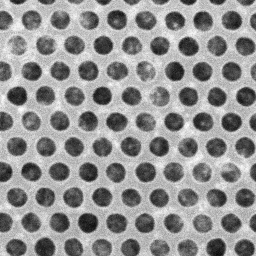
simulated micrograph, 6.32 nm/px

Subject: a regular array of holes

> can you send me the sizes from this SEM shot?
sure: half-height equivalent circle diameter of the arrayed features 130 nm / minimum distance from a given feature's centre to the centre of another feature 179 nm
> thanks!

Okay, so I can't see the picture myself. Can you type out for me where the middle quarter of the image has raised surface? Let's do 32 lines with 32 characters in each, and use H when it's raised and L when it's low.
LHHHLLLLHHHLLLLLHHLLLLLHHHLLLLHH
LLHLLLLLLHHLLLLLHHLLLLLHHLLLLLHH
LLHHLLLLLHHLLLLLHHLLLLLHHLLLLLHH
LHHHLLLLHHHLLLLHHHHLLLLHHHLLLLHH
HHHHHHHHHHHHHHHHHHHHLHHHHHHHHHHH
HHLHHHHHHHHHHHHHLHHHHHHHHHHHHHHH
LLLLHHHHLLLLHHHLLLLHHHLLLLHHHLLL
LLLLLHHLLLLLHHLLLLLHHLLLLLHHHLLL
LLLLLHHLLLLLHHLLLLLHHLLLLLLHHLLL
HLLLLHHHLLLLHHHLLLLHHHLLLLHHHLLL
HHLLHHHHHHHHHHHHLLHHHHHLLHHHHHLL
HHHHHHHHHHHHHHHHHHHHHHHHHHHHHHHH
LHHHLLLLHHHLLLLHHHHLLLHHHHLLLHHH
LHHHLLLLHHHLLLLLHHLLLLLHHLLLLLHH
LHHLLLLLLHLLLLLLHHLLLLLHHLLLLLHH
LHHHLLLLHHHLLLLLHHLLLLLHHLLLLLHH
LHHHHLLLHHHHLLLHHHHLLLHHHHLLLHHH
HHHHHHHHHHHHHHHHHHHHHHHHHHHHHHHH
HLLLHHHHLLHHHHHLLLHHHHHLLHHHHHLL
LLLLLHHLLLLLHHLLLLLHHHLLLLHHHLLL
LLLLLHHLLLLLHHLLLLLHHLLLLLHHLLLL
LLLLLHHLLLLLHHLLLLLHHLLLLLHHHLLL
HLLLHHHHLLLLHHHLLLLHHHLLLLHHHLLL
HHHHHHHHHHHHHHHHHHHHHHHHHHHHHHHL
HHHHHHHHHHHHHHHHHHHHLHHHHHHLHHHH
LHHHLLLLHHHLLLLHHHLLLLLHHLLLLLHH
LLHHLLLLLHLLLLLLHHLLLLLHHLLLLLHH
LLHHLLLLLHLLLLLLHHLLLLLHHLLLLLHH
LHHHLLLLHHHLLLLHHHLLLLLHHLLLLLHH
HHHHHLLHHHHHLLLHHHHHLLHHHHHLHHHH
HHHHHHHHHHHHHHHHHHHHHHHHHHHHHHHH
HLLLHHHHLLLHHHHLLLHHHHLLLHHHHLLL